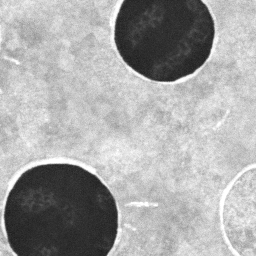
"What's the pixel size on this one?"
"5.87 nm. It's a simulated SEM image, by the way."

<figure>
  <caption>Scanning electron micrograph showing holes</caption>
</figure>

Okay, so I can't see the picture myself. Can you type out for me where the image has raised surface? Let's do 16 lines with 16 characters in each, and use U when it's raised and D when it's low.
UUUUUUUDDDDDDUUU
UUUUUUUDDDDDDUUU
UUUUUUUDDDDDDUUU
UUUUUUUUDDDDDUUU
UUUUUUUUDDDDUUUU
UUUUUUUUUUUUUUUU
UUUUUUUUUUUUUUUU
UUUUUUUUUUUUUUUU
UUUUUUUUUUUUUUUU
UUUUUUUUUUUUUUUU
UUDDDUUUUUUUUUUU
UDDDDDDUUUUUUUUD
DDDDDDDUUUUUUUDD
DDDDDDDUUUUUUUDD
DDDDDDDUUUUUUUDD
UDDDDDDUUUUUUUUD